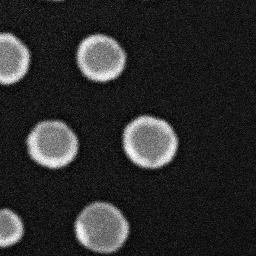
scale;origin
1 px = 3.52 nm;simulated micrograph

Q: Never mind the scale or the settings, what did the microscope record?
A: raised bodies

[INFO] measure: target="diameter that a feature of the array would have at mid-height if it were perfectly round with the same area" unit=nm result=171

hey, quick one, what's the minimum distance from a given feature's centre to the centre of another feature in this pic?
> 341 nm